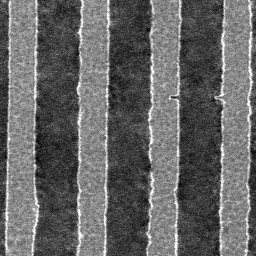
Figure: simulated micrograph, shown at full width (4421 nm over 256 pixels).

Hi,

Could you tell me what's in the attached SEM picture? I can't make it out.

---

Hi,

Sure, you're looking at one or a few lines or trenches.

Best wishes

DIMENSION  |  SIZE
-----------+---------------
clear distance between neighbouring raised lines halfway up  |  460 nanometers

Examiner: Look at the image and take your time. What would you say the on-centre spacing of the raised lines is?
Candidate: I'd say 1230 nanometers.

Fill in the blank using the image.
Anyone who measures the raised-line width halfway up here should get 0.771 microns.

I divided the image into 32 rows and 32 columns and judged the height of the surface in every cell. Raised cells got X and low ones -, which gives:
X----XXXXX----XXXXX---XXXXXX---X
X----XXXXX----XXXXX----XXXXX---X
X----XXXXX----XXXXX----XXXXX---X
X----XXXXX----XXXXX---XXXXXX---X
X----XXXXX----XXXXX---XXXXXX---X
X---XXXXXX----XXXXX---XXXXXX---X
X---XXXXXX----XXXXX---XXXXXX---X
X---XXXXXX----XXXXX---XXXXXX---X
X---XXXXXX----XXXXX---XXXXXX---X
X---XXXXXX---XXXXXX---XXXXXX---X
X----XXXXX---XXXXXX---XXXXXX---X
X---XXXXXX---XXXXXX---XXXXXX---X
X---XXXXXX---XXXXXX---XXXXXX---X
X---XXXXXX---XXXXXX---XXXXXX---X
X---XXXXXX---XXXXXX---XXXXXX---X
X---XXXXXX---XXXXXX---XXXXXX---X
X---XXXXXX---XXXXXX---XXXXXX---X
X---XXXXXX---XXXXXX---XXXXXX---X
X---XXXXXX---XXXXXX---XXXXXX---X
X---XXXXXX---XXXXXX---XXXXXX---X
X---XXXXXX---XXXXXX---XXXXXX---X
X---XXXXXX---XXXXXX---XXXXXX---X
X---XXXXXX---XXXXXX---XXXXXX---X
X---XXXXXX---XXXXXX---XXXXXX---X
X---XXXXXX---XXXXXX---XXXXXX---X
X----XXXXX---XXXXXX---XXXXXX---X
X----XXXXX---XXXXXX---XXXXXX---X
X----XXXXX---XXXXXX---XXXXXX---X
X---XXXXXX---XXXXXX---XXXXXX---X
X---XXXXXX---XXXXXX---XXXXX----X
X---XXXXXX---XXXXXX---XXXXXX---X
X---XXXXXX---XXXXX----XXXXXX---X